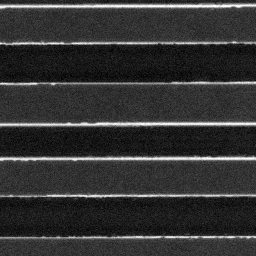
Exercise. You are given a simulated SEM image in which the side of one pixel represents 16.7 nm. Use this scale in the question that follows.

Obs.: lines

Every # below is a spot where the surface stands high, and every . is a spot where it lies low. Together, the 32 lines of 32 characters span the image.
................................
################################
################################
################################
################################
................................
................................
................................
................................
................................
...#############################
################################
################################
################################
################################
................................
................................
................................
................................
................................
################################
################################
################################
################################
................................
................................
................................
................................
................................
................................
################################
################################